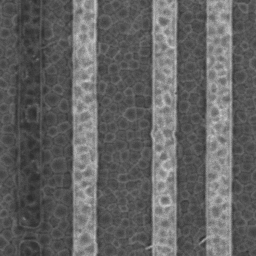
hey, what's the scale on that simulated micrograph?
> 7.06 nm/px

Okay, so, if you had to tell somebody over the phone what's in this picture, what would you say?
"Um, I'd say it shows one or a few lines or trenches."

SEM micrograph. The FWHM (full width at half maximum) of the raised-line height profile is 154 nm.